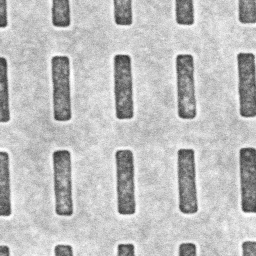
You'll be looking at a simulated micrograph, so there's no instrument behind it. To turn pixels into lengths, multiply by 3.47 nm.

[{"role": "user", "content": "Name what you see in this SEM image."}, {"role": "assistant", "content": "holes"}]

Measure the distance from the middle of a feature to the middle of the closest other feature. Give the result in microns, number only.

0.214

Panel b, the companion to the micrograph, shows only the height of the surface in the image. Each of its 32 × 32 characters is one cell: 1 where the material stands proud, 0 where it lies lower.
01111100011111000111110011111100
01111100011111000111110011111100
01111110011111000111110011111100
11111111111111111111111111111111
11111111111111111111111111111111
11111111111111111111111111111111
11111111111111111111111111111111
01111100011111001111110011111100
01111100011111001111110011111100
01111100011111000111110011111100
01111110011111000111110011111100
01111110011111000111110011111100
01111110011111000111110011111100
01111110011111000111110001111100
01111110011111000111110011111100
11111111111111111111111111111111
11111111111111111111111111111111
11111111111111111111111111111111
11111111111111111111111111111100
01111110011111000111110011111100
01111110011111000111110011111100
01111110011111000111110011111100
01111110011111100111110011111100
01111110011111100111110001111100
01111110011111100111110001111100
01111110011111100111110001111100
01111110011111100111111011111110
11111111111111111111111111111111
11111111111111111111111111111111
11111111111111111111111111111111
11111111111111101111111011111100
01111110011111100111110001111100